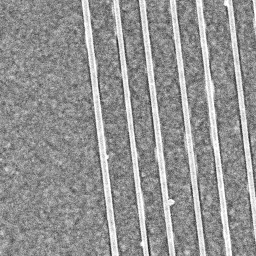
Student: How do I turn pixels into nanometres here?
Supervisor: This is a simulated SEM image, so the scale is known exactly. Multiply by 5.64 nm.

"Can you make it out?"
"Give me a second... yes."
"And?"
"parallel lines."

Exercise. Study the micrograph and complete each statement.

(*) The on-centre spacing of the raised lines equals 161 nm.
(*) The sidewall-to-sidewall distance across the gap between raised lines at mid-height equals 25.6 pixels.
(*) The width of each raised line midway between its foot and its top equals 0.0287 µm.